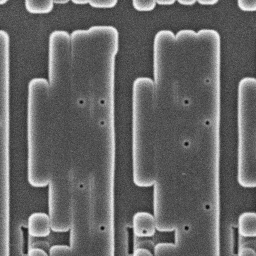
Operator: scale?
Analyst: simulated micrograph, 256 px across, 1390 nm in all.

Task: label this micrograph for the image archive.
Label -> wiring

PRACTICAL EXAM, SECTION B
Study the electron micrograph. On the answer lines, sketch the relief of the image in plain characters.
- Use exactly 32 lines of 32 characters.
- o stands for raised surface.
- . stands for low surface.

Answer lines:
...oooo....ooo...ooo..........oo
....oo..........................
................................
............oo..................
o.....ooooooooo.....ooooooo.....
o.....ooooooooo....oooooooo.....
o.....ooooooooo....oooooooo.....
o.....oooooooo.....oooooooo.....
o.....oooooooo.....oooooooo.....
o.....oooooooo.....oooooooo.....
o...oooooooooo...oooooooooo...oo
o...oooooooooo...oooooooooo...oo
o...oooooooooo...oooooooooo...oo
o...oooooooooo...oooooooooo...oo
o...oooooooooo...oooooooooo...oo
o...oooooooooo...oooooooooo...oo
o...oooooooooo...oooooooooo...oo
o...oooooooooo...oooooooooo...oo
o...oooooooooo...oooooooooo...oo
o...oooooooooo...oooooooooo...oo
o...oooooooooo...oooooooooo...oo
o...oooooooooo...oooooooooo...oo
o...oooooooooo...oooooooooo...oo
o.....oooooooo.....oooooooo.....
o.....oooooooo.....oooooooo.....
o.....oooooooo.....oooooooo.....
o.....oooooooo.....oooooooo.....
o...oooooooooo...oooooooooo...oo
o...oooooooooo...oooooooooo...oo
o........ooooo........ooooo.....
o........ooooo......ooooooo.....
o...oooooooooo...oooooooooo...oo